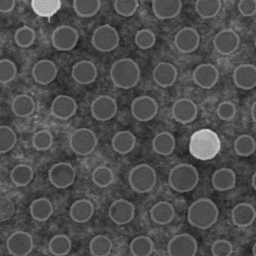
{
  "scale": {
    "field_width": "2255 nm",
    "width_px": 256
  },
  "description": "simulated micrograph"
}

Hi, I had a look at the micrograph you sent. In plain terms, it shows a regular array of raised bodies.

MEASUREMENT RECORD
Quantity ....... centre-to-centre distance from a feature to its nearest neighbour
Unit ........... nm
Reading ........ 348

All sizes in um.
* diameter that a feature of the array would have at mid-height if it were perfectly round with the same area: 0.201